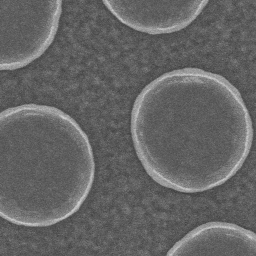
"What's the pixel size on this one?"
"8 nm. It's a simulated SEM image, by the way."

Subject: raised bodies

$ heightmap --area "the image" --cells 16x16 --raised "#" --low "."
####...######...
###.....####....
###.............
##..............
...........#....
.........#####..
.........######.
####....########
#####...########
######...######.
######...######.
######.....###..
#####...........
####............
............###.
...........#####